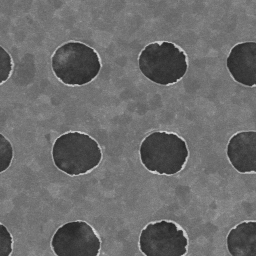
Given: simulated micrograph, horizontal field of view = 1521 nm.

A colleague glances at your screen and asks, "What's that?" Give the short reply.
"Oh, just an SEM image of holes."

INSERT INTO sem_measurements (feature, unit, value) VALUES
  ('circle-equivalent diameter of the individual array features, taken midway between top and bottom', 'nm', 266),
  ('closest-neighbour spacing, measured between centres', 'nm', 518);